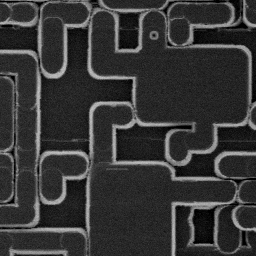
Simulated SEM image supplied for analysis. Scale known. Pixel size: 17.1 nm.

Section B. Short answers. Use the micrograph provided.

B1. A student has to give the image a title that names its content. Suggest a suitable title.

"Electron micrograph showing wiring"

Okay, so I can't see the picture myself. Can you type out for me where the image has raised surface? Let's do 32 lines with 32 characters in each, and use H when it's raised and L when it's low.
HHHHHHHHHHHLLHHHHHHHHHHHHHHHHLLH
HHHHHHHHHHHHHHHLLLHHHHHHHHHHHLHH
HHHHHHHHHHHHHHHLLLHHHHHHHHHHHLLH
LLLLLHHHHLLHHHHLLLHHHHHHLLLLLLLL
LLLLLHHHLLLHHHHLLLHHHHHHLLLLLLLL
LLLLLHHHLLLHHHHLLHHHHHHHLLLLLLLL
HHHLLHHHLLLHHHHHHHHHHHHHHHHHHHHL
HHHHHHHHLLLHHHHHHHHHHHHHHHHHHHHL
HHHHHHHHLLLHHHHHHHHHHHHHHHHHHHHL
HHHHHLLLLLLLHHHHHHHHHHHHHHHHHHHL
HHHHHLLLLLLLLLLLLHHHHHHHHHHHHHHL
HHHHHLLLLLLLLLLLLHHHHHHHHHHHHHHL
HHHHHLLLLLLLLLLLLHHHHHHHHHHHHHHL
HHHHHLLLLLLLHHHHHHHHHHHHHHHHHHHH
HHHHHLLLLLLHHHHHHHHHHHHHHHHHHHHH
HHHHHLLLLLLHHHHHHLLLHHHHHHHHHHLH
HHHHHLLLLLLHHHLLLLLLLHHHHHHLLLLL
HHHHHLLLLLLHHHLLLLLLLHHHHHHLLLLL
HHHHHLLLLLLHHHLLLLLLLHHHHHHLLLLL
HHHHHHHHHHHHHHLLLLLLLHHHLLLLHHHH
HHHHHHHHHHHHHHHHHHHHHLHLLLLHHHHH
HHHHHHHHHHHHHHHHHHHHHHLLLLLHHHHH
HHHHHHHHLLLHHHHHHHHHHHHHHHHHHHHH
HHHHHHHHLLLHHHHHHHHHHHHHHHHHHHHH
HHHHHHHHLLLHHHHHHHHHHHHHHHHHHHHH
HHHHHLLLLLLHHHHHHHHHHHLLLLLLLLHH
HHHHHLLLLLLHHHHHHHHHHHLLLLLLLHHH
HHHHHLLLLLLHHHHHHHHHHHLLLLLLLHHH
HHHHLLLLLLLHHHHHHHHHHHLLLLLLLLHH
HHHHHHHHHHHHHHHHHHHHHHLLLLLLLLLL
HHHHHHHHHHHHHHHHHHHHHHLLLLLLLLLL
HHHHHHHHHHHHHHHHHHHHHHLLLLLLLLLL